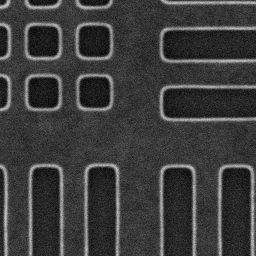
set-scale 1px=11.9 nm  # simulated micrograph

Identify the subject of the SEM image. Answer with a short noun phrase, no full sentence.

groups of lines, slits or small figures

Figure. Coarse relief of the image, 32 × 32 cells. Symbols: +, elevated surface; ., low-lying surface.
.+++...+++....++++++++++++++++++
++++++++++++++++++++++++++++++++
++++++++++++++++++++++++++++++++
.+++...+++....++++++++++++++++++
.++.....++....++++++............
.++.....++....++++++............
.++....+++....++++++............
+++++++++++++++++++++...........
++++++++++++++++++++++++++++++++
+++++.+++++..+++++++++++++++++++
.++....+++....++++++++++++++++++
.++.....++....++++++............
.++.....++....++++++............
.+++...+++...+++++++............
+++++++++++++++++++++...........
++++++++++++++++++++++++++++++++
++++++++++++++++++++++++++++++++
++++++++++++++++++++++++++++++++
++++++++++++++++++++++++++++++++
++++++++++++++++++++++++++++++++
++++++++++++++++++++++++++++++++
.+++....+++....+++++....++++...+
.+++....+++....+++++....+++.....
.+++....+++....+++++....+++.....
.+++....+++....+++++....+++.....
.+++....+++....+++++....+++.....
.+++....+++....+++++....+++.....
.+++....+++....+++++....+++.....
.+++....+++....+++++....+++.....
.+++....+++....+++++....+++.....
.+++....+++....+++++....+++.....
.+++....+++....+++++....+++.....